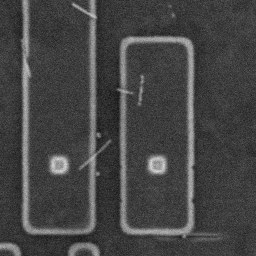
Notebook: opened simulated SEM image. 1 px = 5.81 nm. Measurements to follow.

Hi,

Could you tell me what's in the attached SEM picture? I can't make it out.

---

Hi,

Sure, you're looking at wiring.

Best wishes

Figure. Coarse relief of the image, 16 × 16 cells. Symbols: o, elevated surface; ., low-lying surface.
..oooo..........
..oooo..........
..oooo..ooo.....
..oooo..oooo....
..oooo..oooo....
..oooo..oooo....
..oooo..oooo....
..oooo..oooo....
..oooo..oooo....
..oooo..oooo....
..oooo..oooo....
..oooo..oooo....
..oooo..oooo....
..oooo..oooo....
..ooo...ooo.....
o....o..........